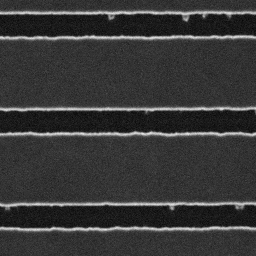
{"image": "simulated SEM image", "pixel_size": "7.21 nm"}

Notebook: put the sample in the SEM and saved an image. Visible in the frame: lines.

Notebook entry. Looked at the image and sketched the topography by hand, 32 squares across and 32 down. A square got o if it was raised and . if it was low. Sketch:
oooooooooooooooooooooooooooooooo
oooooooooooooooooooooooooooooooo
................................
................................
................................
oooooooooooooooooooooooooooooooo
oooooooooooooooooooooooooooooooo
oooooooooooooooooooooooooooooooo
oooooooooooooooooooooooooooooooo
oooooooooooooooooooooooooooooooo
oooooooooooooooooooooooooooooooo
oooooooooooooooooooooooooooooooo
oooooooooooooooooooooooooooooooo
oooooooooooooooooooooooooooooooo
................................
................................
................................
oooooooooooooooooooooooooooooooo
oooooooooooooooooooooooooooooooo
oooooooooooooooooooooooooooooooo
oooooooooooooooooooooooooooooooo
oooooooooooooooooooooooooooooooo
oooooooooooooooooooooooooooooooo
oooooooooooooooooooooooooooooooo
oooooooooooooooooooooooooooooooo
ooooooooooooo.oooooooo.ooooo....
................................
................................
..............o..o.........o.ooo
oooooooooooooooooooooooooooooooo
oooooooooooooooooooooooooooooooo
oooooooooooooooooooooooooooooooo